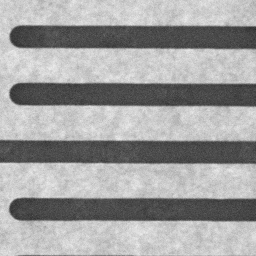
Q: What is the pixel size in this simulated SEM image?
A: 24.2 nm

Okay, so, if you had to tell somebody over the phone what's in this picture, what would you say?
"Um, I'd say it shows groups of lines, slits or small figures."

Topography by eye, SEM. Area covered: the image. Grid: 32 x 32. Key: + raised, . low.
++++++++++++++++++++++++++++++++
++++++++++++++++++++++++++++++++
++++++++++++++++++++++++++++++++
++..............................
+...............................
++..............................
++++++++++++++++++++++++++++++++
++++++++++++++++++++++++++++++++
++++++++++++++++++++++++++++++++
++++++++++++++++++++++++++++++++
++..............................
+...............................
+...............................
++++++++++++++++++++++++++++++++
++++++++++++++++++++++++++++++++
++++++++++++++++++++++++++++++++
++++++++++++++++++++++++++++++++
.......++++...++++++++++++++++++
................................
................................
++++++++++++++++................
++++++++++++++++++++++++++++++++
++++++++++++++++++++++++++++++++
++++++++++++++++++++++++++++++++
++++++++++++++++++++++++++++++++
+...............................
+...............................
++..............................
++++++++++++++++++++++++++++++++
++++++++++++++++++++++++++++++++
++++++++++++++++++++++++++++++++
++++++++++++++++++++++++++++++++